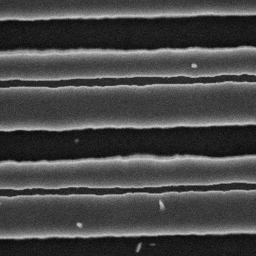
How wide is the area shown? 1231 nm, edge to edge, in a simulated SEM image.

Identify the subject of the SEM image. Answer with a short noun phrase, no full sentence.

lines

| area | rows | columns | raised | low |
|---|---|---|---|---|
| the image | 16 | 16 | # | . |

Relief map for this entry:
################
................
................
################
################
################
################
################
................
................
################
################
################
################
################
................